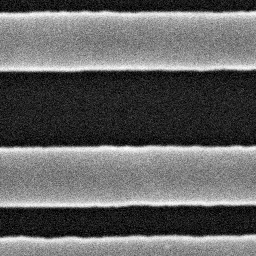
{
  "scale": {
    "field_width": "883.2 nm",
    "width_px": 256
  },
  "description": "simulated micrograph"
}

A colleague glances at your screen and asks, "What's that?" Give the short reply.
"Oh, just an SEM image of lines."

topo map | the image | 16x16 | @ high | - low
----------------
@@@@@@@@@@@@@@@@
@@@@@@@@@@@@@@@@
@@@@@@@@@@@@@@@@
----------------
----------------
----------------
----------------
----------------
@@@@@@@@@@@@@@@@
@@@@@@@@@@@@@@@@
@@@@@@@@@@@@@@@@
@@@@@@@@@@@@@@@@
----------------
----------------
@@@@@@@@@@@@@@@@